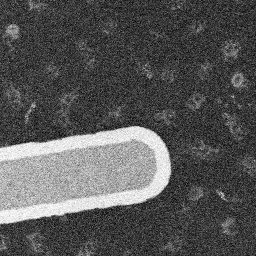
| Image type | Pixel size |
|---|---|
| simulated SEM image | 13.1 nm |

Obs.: one or a few lines or trenches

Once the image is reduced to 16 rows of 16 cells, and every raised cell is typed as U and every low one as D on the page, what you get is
DDDDDDDDDDDDDDDD
DDDDDDDDDDDDDDDD
DDDDDDDDDDDDDDDD
DDDDDDDDDDDDDDDD
DDDDDDDDDDDDDDDD
DDDDDDDDDDDDDDDD
DDDDDDDDDDDDDDDD
DDDDDDDDDDDDDDDD
DDDDDDDUUDDDDDDD
DUUUUUUUUUDDDDDD
UUUUUUUUUUDDDDDD
UUUUUUUUUUDDDDDD
UUUUUUUDDDDDDDDD
UDDDDDDDDDDDDDDD
DDDDDDDDDDDDDDDD
DDDDDDDDDDDDDDDD